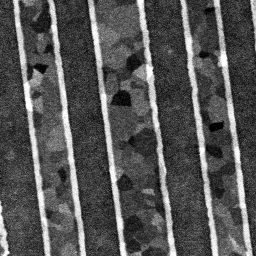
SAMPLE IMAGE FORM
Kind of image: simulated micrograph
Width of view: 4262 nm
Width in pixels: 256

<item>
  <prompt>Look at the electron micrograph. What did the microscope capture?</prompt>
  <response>one or a few lines or trenches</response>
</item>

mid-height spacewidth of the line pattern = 681 nanometres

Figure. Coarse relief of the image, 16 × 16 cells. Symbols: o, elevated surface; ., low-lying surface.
.oo...ooo...oo..
.oo...ooo...oo..
.oo...ooo...oo..
.ooo..ooo...oo..
..oo..ooo...oo..
..oo..ooo...oo..
..oo...ooo..oo..
..oo...ooo..oo..
..oo...ooo...oo.
..oo...ooo...oo.
..ooo..ooo...oo.
..ooo..ooo...oo.
...oo..ooo...oo.
...oo..oooo..oo.
...oo...ooo..oo.
...oo...ooo..ooo